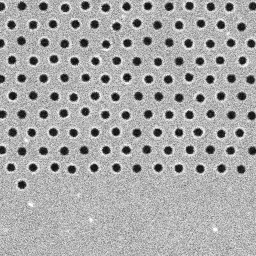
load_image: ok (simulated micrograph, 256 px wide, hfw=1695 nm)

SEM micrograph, a regular array of holes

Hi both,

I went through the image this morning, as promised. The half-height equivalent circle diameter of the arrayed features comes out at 59.8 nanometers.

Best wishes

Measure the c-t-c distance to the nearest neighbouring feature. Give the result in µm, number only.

0.13